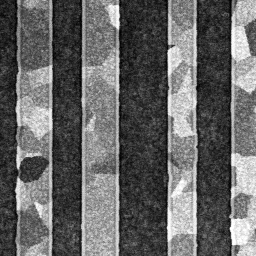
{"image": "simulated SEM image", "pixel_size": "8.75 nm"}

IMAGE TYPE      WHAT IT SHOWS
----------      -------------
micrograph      one or a few lines or trenches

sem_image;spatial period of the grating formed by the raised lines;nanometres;646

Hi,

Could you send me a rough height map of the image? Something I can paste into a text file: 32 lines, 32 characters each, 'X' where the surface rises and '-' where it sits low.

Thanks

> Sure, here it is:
--XXXX-----XXXX------XXX-----XXX
--XXXX-----XXXX------XXX-----XXX
--XXXX-----XXXX------XXX-----XXX
--XXXX-----XXXX------XXX-----XXX
--XXXX-----XXXX------XXX-----XXX
--XXXX-----XXXX------XXX-----XXX
--XXXX-----XXXX------XXX-----XXX
--XXXX----XXXXX------XXX-----XXX
--XXXX-----XXXX------XXX-----XXX
--XXXX-----XXXX------XXX-----XXX
--XXXX----XXXXX------XXX-----XXX
--XXXX-----XXXX------XXX-----XXX
--XXXX----XXXXX------XXX-----XXX
--XXXX-----XXXX------XXX-----XXX
--XXXX-----XXXX------XXX-----XXX
--XXXX-----XXXX------XXX-----XXX
--XXXX-----XXXX------XXX-----XXX
--XXXX-----XXXX------XXX-----XXX
--XXXX----XXXXX------XXX-----XXX
--XXXX----XXXXX------XXX-----XXX
--XXXX----XXXXX------XXX-----XXX
--XXXX-----XXXX------XXX-----XXX
--XXXX-----XXXX------XXX-----XXX
--XXXX----XXXXX------XXX-----XXX
--XXXX----XXXXX------XXX-----XXX
--XXXX----XXXXX------XXX-----XXX
--XXXX----XXXXX------XXX-----XXX
--XXXX----XXXXX------XXX-----XXX
--XXXX----XXXXX------XXX-----XXX
--XXXX----XXXXX------XXX-----XXX
--XXXX----XXXXX------XXX-----XXX
--XXXX----XXXXX------XXX-----XXX